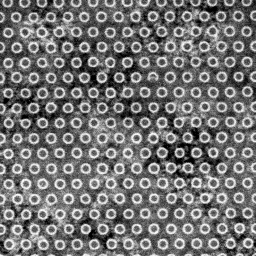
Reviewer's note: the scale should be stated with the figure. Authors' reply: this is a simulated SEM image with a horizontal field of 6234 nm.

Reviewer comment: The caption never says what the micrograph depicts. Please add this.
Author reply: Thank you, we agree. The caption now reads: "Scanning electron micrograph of a regular array of raised bodies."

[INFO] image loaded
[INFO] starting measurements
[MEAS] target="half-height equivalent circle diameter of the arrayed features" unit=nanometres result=213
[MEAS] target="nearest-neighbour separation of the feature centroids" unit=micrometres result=0.411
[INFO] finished